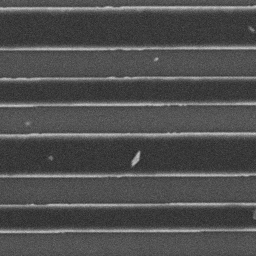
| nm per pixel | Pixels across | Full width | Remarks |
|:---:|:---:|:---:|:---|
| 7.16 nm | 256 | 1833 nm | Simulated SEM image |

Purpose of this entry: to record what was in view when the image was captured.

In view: lines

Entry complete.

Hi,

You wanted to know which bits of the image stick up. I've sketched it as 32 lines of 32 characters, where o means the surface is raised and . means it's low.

................................
oooooooooooooooooooooooooooooooo
oooooooooooooooooooooooooooooooo
oooooooooooooooooooooooooooooooo
oooooooooooooooooooooooooooooooo
oooooooooooooooooooooooooooooooo
................................
................................
................................
................................
oooooooooooooooooooooooooooooooo
oooooooooooooooooooooooooooooooo
oooooooooooooooooooooooooooooooo
................................
................................
................................
................................
oooooooooooooooooooooooooooooooo
oooooooooooooooooooooooooooooooo
oooooooooooooooooooooooooooooooo
oooooooooooooooooooooooooooooooo
oooooooooooooooooooooooooooooooo
................................
................................
................................
.....................ooooooooooo
oooooooooooooooooooooooooooooooo
oooooooooooooooooooooooooooooooo
oooooooooooooooooooooooooooooooo
................................
................................
................................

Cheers